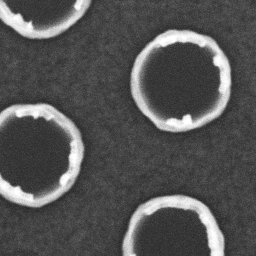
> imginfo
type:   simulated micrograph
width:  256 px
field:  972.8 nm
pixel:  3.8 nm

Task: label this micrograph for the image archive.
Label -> raised bodies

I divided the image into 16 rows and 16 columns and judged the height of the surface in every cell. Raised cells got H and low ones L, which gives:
HHHHHLLLLLLLLLLL
LHHHLLLLLLLLLLLL
LLLLLLLLLLHHHLLL
LLLLLLLLLHHHHHLL
LLLLLLLLHHHHHHLL
LLLLLLLLHHHHHHLL
LLLLLLLLLHHHHHLL
HHHHLLLLLLHHHLLL
HHHHHLLLLLLLLLLL
HHHHHLLLLLLLLLLL
HHHHHLLLLLLLLLLL
HHHHLLLLLLLLLLLL
LHHLLLLLLLHHLLLL
LLLLLLLLLHHHHLLL
LLLLLLLLHHHHHHLL
LLLLLLLLHHHHHHLL